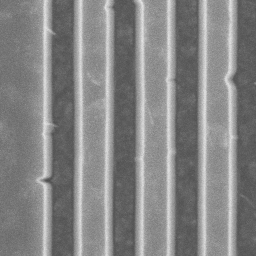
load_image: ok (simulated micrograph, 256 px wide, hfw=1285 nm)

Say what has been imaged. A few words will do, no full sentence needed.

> one or a few lines or trenches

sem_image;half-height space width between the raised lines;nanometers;142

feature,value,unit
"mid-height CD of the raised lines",165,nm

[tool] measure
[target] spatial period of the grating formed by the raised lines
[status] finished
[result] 310 nm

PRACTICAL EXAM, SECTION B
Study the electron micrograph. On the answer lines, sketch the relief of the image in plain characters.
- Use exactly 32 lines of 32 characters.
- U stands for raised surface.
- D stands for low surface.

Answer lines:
UUUUUUDDDDUUUUDDDUUUUUDDDUUUUDDD
UUUUUUDDDDUUUUDDDUUUUDDDDUUUUDDD
UUUUUUDDDDUUUUDDDUUUUDDDDUUUUDDD
UUUUUUDDDDUUUUDDDUUUUUDDDUUUUDDD
UUUUUUDDDDUUUUDDDUUUUUDDDUUUUDDD
UUUUUUDDDDUUUUDDDUUUUDDDDUUUUDDD
UUUUUUDDDDUUUUDDDUUUUUDDDUUUUDDD
UUUUUUDDDDUUUUDDDUUUUUDDDUUUUDDD
UUUUUUDDDDUUUUDDDUUUUUDDDUUUUDDD
UUUUUUDDDDUUUUDDDUUUUUDDDUUUUDDD
UUUUUUDDDDUUUUDDDUUUUUDDDUUUUDDD
UUUUUUDDDDUUUUDDDUUUUUDDDUUUUDDD
UUUUUUDDDDUUUUDDDUUUUUDDDUUUUDDD
UUUUUUDDDDUUUUDDDUUUUUDDDUUUUDDD
UUUUUUDDDDUUUUDDDUUUUUDDDUUUUDDD
UUUUUUDDDDUUUUDDDUUUUDDDDUUUUDDD
UUUUUUDDDDUUUUDDDUUUUUDDDUUUUDDD
UUUUUUDDDDUUUUDDDUUUUUDDDUUUUDDD
UUUUUUDDDDUUUUDDDUUUUUDDDUUUUDDD
UUUUUUDDDDUUUUDDDUUUUUDDDUUUUDDD
UUUUUUDDDDUUUUDDDUUUUUDDDUUUUDDD
UUUUUUDDDDUUUUDDDUUUUUDDDUUUUDDD
UUUUUUDDDDUUUUDDDUUUUUDDDUUUUDDD
UUUUUUDDDDUUUUDDDUUUUUDDDUUUUDDD
UUUUUUDDDDUUUUDDDUUUUUDDDUUUUDDD
UUUUUUDDDDUUUUDDDUUUUUDDDUUUUDDD
UUUUUUDDDDUUUUDDDUUUUUDDDUUUUDDD
UUUUUUDDDDUUUUDDDUUUUDDDDUUUUDDD
UUUUUUDDDDUUUUDDDUUUUDDDDUUUUDDD
UUUUUUDDDDUUUUDDDUUUUDDDDUUUUDDD
UUUUUUDDDDUUUUDDDUUUUDDDDUUUUDDD
UUUUUUDDDDUUUUDDDUUUUDDDDUUUUDDD